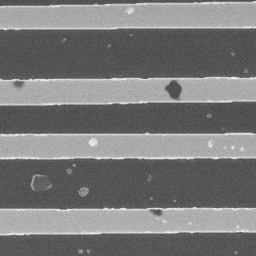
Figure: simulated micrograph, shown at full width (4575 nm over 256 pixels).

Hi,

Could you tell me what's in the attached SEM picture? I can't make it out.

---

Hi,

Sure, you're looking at lines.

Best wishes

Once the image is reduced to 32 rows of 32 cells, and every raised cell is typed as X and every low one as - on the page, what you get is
-----------------XXXXXXXXXXXXXXX
XXXXXXXXXXXXXXXXXXXXXXXXXXXXXXXX
XXXXXXXXXXXXXXXXXXXXXXXXXXXXXXXX
XXXXXXXXXXXXXXX-----------------
--------------------------------
--------------------------------
--------------------------------
--------------------------------
--------------------------------
--------------------------------
XXXXXXXXXXXXXXXXXXXXXXXXXXXXXXXX
XXXXXXXXXXXXXXXXXXXXXXXXXXXXXXXX
XXXXXXXXXXXXXXXXXXXXXXXXXXXXXXXX
--------------------------------
--------------------------------
--------------------------------
--------------------------------
XXXXXXXXXXXXXXXXXXXXXXXXXXXXXXXX
XXXXXXXXXXXXXXXXXXXXXXXXXXXXXXXX
XXXXXXXXXXXXXXXXXXXXXXXXXXXXXXXX
--------------------------------
--------------------------------
--------------------------------
--------------------------------
--------------------------------
--------------------------------
XXXXXXXXXXXXXXXXXXXXXXXXXXXXXXXX
XXXXXXXXXXXXXXXXXXXXXXXXXXXXXXXX
XXXXXXXXXXXXXXXXXXXXXXXXXXXXXXXX
--------------------------------
--------------------------------
--------------------------------